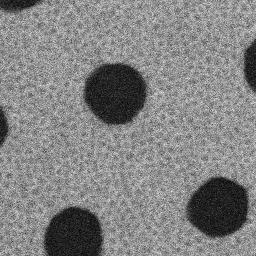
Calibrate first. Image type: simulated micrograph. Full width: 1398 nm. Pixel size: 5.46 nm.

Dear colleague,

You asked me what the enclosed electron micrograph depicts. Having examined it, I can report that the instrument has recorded holes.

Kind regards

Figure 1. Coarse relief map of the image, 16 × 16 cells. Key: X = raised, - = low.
--XXXXXXXXXXXXXX
XXXXXXXXXXXXXXXX
XXXXXXXXXXXXXXXX
XXXXXXXXXXXXXXX-
XXXXXX---XXXXXX-
XXXXX----XXXXXXX
XXXXX----XXXXXXX
XXXXXX--XXXXXXXX
XXXXXXXXXXXXXXXX
XXXXXXXXXXXXXXXX
XXXXXXXXXXXXXXXX
XXXXXXXXXXXXX--X
XXXXXXXXXXXX---X
XXX---XXXXXX---X
XXX---XXXXXXX--X
XXX---XXXXXXXXXX